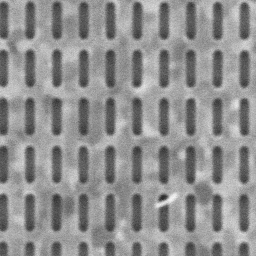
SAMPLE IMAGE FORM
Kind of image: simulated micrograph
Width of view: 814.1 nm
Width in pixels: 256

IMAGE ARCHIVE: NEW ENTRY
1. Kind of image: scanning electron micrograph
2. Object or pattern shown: groups of lines, slits or small figures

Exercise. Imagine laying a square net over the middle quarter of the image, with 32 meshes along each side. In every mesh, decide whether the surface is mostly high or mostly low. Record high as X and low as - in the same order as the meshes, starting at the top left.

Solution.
XXXX--XXXX---XXXX---XXX---XXXX--
XXXX--XXXX---XXXX---XXX---XXXX--
XXXX--XXXX---XXXX---XXX---XXXX--
XXXX--XXXX---XXXX---XXX---XXXX--
XXXX--XXXX---XXXX---XXX---XXXX--
XXXX--XXXXX--XXXX--XXXXX--XXXXX-
XXXXXXXXXXXXXXXXXXXXXXXXXXXXXXXX
XXXXXXXXXXXXXXXXXXXXXXXXXXXXXXXX
XXXX--XXXXX-XXXXXX-XXXXX--XXXXX-
XXXX--XXXX---XXXX---XXXX--XXXX--
XXX---XXXX---XXXX---XXX---XXXX--
XXXX--XXXX---XXXX---XXX---XXXX--
XXXX--XXXX---XXXX---XXX---XXXX--
XXX---XXXX---XXXX---XXX---XXXX--
XXXX--XXXX---XXXX---XXX---XXXX--
XXXX--XXXX---XXXX---XXX---XXXX--
XXXX--XXXX---XXXX---XXX---XXXX--
XXXX--XXXXX--XXXX--XXXXX--XXXXX-
XXXXXXXXXXXXXXXXXXXXXXXXXXXXXXXX
XXXXXXXXXXXXXXXXXXXXXXXXXXXXXXXX
XXXX-XXXXXX-XXXXX--XXXXX--XXXXX-
XXXX--XXXX---XXXX---XXXX--XXXX--
XXX---XXXX---XXXX---XXX---XXXX--
XXX---XXXX---XXXX---XXX---XXXX--
XXX---XXXX---XXXX---XXX---XXXX--
XXX---XXXX---XXXX---XXX---XXXX--
XXX---XXXX---XXXX---XXX---XXXX--
XXX---XXXX---XXXX---XXX---XXXX--
XXX---XXXX---XXXX---XXX---XXXX--
XXXX--XXXXX--XXXX--XXXXX--XXXXX-
XXXXXXXXXXXXXXXXXXXXXXXXXXXXXXXX
XXXXXXXXXXXXXXXXXXXXXXXXXXXXXXXX